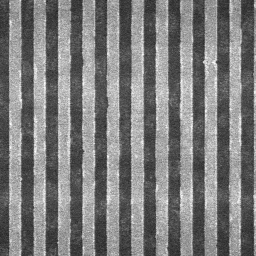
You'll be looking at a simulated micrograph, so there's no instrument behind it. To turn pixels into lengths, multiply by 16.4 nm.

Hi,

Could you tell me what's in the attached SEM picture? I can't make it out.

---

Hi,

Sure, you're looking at parallel lines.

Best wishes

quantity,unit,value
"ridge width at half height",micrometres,0.195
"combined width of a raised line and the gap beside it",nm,401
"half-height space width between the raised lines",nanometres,207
